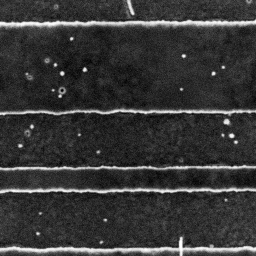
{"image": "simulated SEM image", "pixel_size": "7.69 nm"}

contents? lines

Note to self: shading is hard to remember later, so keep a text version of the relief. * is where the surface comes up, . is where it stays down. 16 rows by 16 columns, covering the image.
................
****************
****************
****************
****************
****************
****************
................
................
................
****************
****************
................
................
................
*..........**..*